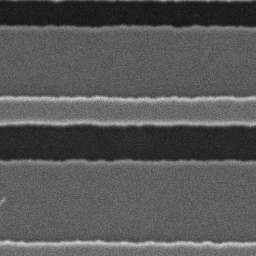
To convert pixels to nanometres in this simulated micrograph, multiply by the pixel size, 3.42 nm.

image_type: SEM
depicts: lines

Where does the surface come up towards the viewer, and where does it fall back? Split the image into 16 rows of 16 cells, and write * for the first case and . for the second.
................
................
****************
****************
****************
****************
****************
****************
................
................
****************
****************
****************
****************
****************
****************